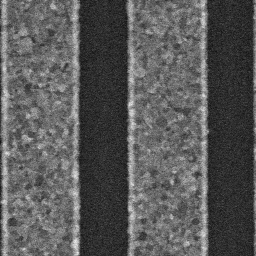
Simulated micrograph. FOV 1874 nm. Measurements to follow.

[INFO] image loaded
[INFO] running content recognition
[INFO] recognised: one or a few lines or trenches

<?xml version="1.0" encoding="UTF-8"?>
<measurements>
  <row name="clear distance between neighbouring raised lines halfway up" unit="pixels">56.2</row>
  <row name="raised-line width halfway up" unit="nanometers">526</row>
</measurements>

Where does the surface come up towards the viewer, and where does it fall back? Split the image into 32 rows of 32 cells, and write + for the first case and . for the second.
.++++++++.......+++++++++.......
.++++++++.......+++++++++.......
.++++++++.......+++++++++.......
.++++++++.......+++++++++.......
.++++++++.......+++++++++.......
.+++++++++......+++++++++.......
.++++++++.......+++++++++.......
.++++++++.......+++++++++.......
.++++++++.......+++++++++.......
.++++++++.......+++++++++.......
.++++++++.......+++++++++.......
.++++++++.......+++++++++.......
.++++++++.......+++++++++.......
.++++++++.......+++++++++.......
.++++++++.......+++++++++.......
.++++++++.......+++++++++.......
.++++++++........++++++++.......
.++++++++........++++++++.......
.++++++++........++++++++.......
.++++++++.......+++++++++.......
.++++++++.......+++++++++.......
.++++++++.......+++++++++.......
.++++++++........++++++++.......
.++++++++.......+++++++++.......
.++++++++........++++++++.......
.+++++++++.......++++++++.......
.+++++++++.......++++++++.......
.+++++++++.......++++++++.......
.++++++++........++++++++.......
.++++++++........++++++++.......
.++++++++........++++++++.......
.+++++++++......+++++++++.......